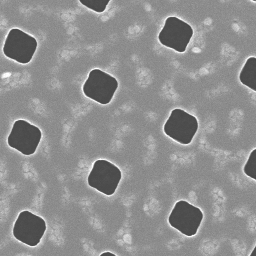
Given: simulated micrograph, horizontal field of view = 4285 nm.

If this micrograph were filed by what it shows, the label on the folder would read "a regular array of holes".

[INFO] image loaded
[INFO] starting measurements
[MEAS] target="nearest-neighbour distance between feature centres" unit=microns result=1.51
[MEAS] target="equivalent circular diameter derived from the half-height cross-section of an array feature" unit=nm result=542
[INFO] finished